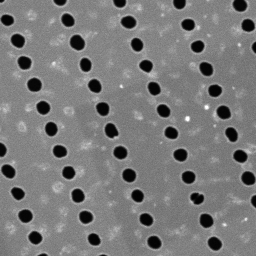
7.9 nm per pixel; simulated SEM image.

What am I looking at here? a regular array of holes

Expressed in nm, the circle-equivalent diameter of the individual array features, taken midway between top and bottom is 106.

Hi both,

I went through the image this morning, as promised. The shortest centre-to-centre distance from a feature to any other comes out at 185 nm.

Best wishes